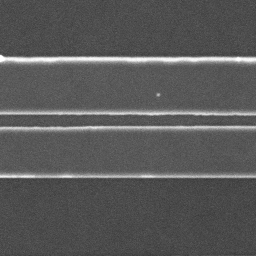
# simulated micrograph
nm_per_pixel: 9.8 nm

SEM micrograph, lines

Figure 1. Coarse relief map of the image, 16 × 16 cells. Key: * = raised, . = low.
................
................
................
................
****************
****************
****************
****************
****************
****************
****************
................
................
................
................
................